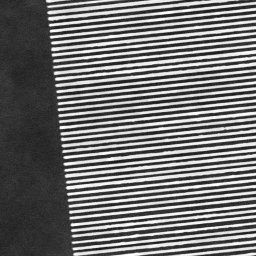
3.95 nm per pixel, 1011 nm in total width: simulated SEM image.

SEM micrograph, parallel lines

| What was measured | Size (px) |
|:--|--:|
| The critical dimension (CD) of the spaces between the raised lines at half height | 3.47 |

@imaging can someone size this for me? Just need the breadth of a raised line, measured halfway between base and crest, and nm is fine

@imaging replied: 10.3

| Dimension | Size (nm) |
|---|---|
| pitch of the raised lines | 24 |